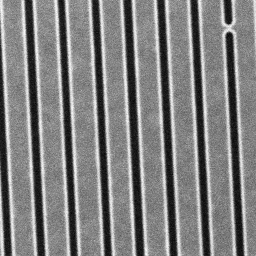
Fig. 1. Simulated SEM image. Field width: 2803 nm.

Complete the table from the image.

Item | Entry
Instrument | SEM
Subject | parallel lines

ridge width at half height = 245 nanometres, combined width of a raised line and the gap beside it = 0.362 micrometres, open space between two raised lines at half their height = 118 nm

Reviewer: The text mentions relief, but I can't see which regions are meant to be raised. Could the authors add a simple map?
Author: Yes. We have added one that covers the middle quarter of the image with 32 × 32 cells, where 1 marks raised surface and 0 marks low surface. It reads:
01111110001111100011111100111111
01111110001111100011111100011111
01111110001111100011111100011111
00111110001111100011111100011111
00111110001111100011111100011111
00111110001111110011111100011111
00111111001111110011111100011111
00111111001111110001111100011111
00111111001111110001111100011111
00111111001111110001111100011111
00111111001111110001111100011111
00111111001111110001111100011111
00111111000111110001111100011111
00111111000111110001111100011111
00111111000111110001111100011111
00111111000111110001111100011111
00111111000111110001111100011111
00111111000111110001111100011111
00111111000111110001111100011111
00111111000111110001111110011111
00111111000111110001111110011111
00111111000111110001111110001111
00111111000111110001111110001111
00011111000111110001111110001111
00011111000111110001111110001111
00011111000111111001111110001111
00011111100111111001111110001111
00011111100111111000111110001111
00011111100111111000111110001111
00011111100111111000111110001111
00011111100111111000111110001111
00011111100011111000111110001111